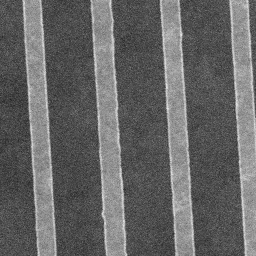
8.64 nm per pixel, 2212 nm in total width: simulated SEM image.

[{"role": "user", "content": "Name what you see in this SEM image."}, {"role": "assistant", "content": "one or a few lines or trenches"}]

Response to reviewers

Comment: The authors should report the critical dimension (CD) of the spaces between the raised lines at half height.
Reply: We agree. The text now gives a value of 0.434 microns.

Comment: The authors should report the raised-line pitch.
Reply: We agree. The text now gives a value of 595 nm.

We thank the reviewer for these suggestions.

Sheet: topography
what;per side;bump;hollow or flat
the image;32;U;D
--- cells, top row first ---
DDDUUDDDDDDUUUDDDDDDUUDDDDDDDUUD
DDDUUDDDDDDDUUDDDDDDUUDDDDDDDUUD
DDDUUDDDDDDDUUDDDDDDUUUDDDDDDUUD
DDDUUDDDDDDDUUDDDDDDUUUDDDDDDUUD
DDDUUDDDDDDDUUDDDDDDUUUDDDDDDUUD
DDDUUDDDDDDDUUDDDDDDUUUDDDDDDUUD
DDDUUDDDDDDDUUDDDDDDDUUDDDDDDUUD
DDDUUDDDDDDDUUDDDDDDDUUDDDDDDUUD
DDDUUUDDDDDDUUDDDDDDDUUDDDDDDUUD
DDDDUUDDDDDDUUDDDDDDDUUDDDDDDUUD
DDDDUUDDDDDDUUDDDDDDDUUDDDDDDUUU
DDDDUUDDDDDDUUUDDDDDDUUDDDDDDDUU
DDDDUUDDDDDDUUUDDDDDDUUDDDDDDDUU
DDDDUUDDDDDDUUUDDDDDDUUDDDDDDDUU
DDDDUUDDDDDDUUUDDDDDDUUDDDDDDDUU
DDDDUUDDDDDDUUUDDDDDDUUDDDDDDDUU
DDDDUUDDDDDDUUUDDDDDDUUDDDDDDDUU
DDDDUUDDDDDDUUUDDDDDDUUDDDDDDDUU
DDDDUUDDDDDDDUUDDDDDDUUDDDDDDDUU
DDDDUUDDDDDDDUUDDDDDDUUUDDDDDDUU
DDDDUUDDDDDDDUUDDDDDDUUUDDDDDDUU
DDDDUUDDDDDDDUUDDDDDDUUUDDDDDDUU
DDDDUUDDDDDDDUUDDDDDDUUUDDDDDDUU
DDDDUUDDDDDDDUUDDDDDDDUUDDDDDDUU
DDDDUUUDDDDDDUUDDDDDDDUUDDDDDDUU
DDDDUUUDDDDDDUUDDDDDDDUUDDDDDDUU
DDDDDUUDDDDDDUUDDDDDDDUUDDDDDDUU
DDDDDUUDDDDDDUUDDDDDDDUUDDDDDDUU
DDDDDUUDDDDDDUUDDDDDDDUUDDDDDDDU
DDDDDUUDDDDDDUUUDDDDDDUUDDDDDDDU
DDDDDUUDDDDDDUUUDDDDDDUUDDDDDDDU
DDDDDUUDDDDDDUUUDDDDDDUUDDDDDDDU